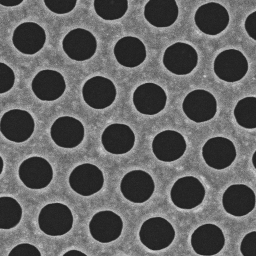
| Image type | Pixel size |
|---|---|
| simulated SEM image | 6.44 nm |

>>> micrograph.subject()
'a regular array of holes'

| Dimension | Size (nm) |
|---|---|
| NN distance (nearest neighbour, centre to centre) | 326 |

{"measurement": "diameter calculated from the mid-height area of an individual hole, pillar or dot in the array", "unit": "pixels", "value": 33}